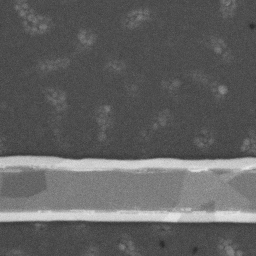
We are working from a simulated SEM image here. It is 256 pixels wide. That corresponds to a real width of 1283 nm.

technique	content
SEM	one or a few lines or trenches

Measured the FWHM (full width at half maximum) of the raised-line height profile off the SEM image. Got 262 nm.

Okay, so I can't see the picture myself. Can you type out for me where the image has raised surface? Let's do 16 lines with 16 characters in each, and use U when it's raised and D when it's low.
DDDDDDDDDDDDDDDD
DDDDDDDDDDDDDDDD
DDDDDDDDDDDDDDDD
DDDDDDDDDDDDDDDD
DDDDDDDDDDDDDDDD
DDDDDDDDDDDDDDDD
DDDDDDDDDDDDDDDD
DDDDDDDDDDDDDDDD
DDDDDDDDDDDDDDDD
DDDDDDDDDDDDDDDD
UUUUUUUUUUUUUUUU
UUUUUUUUUUUUUUUU
UUUUUUUUUUUUUUUU
DUUDDDUDDUUUUUUU
DDDDDDDDDDDDDDDD
DDDDDDDDDDDDDDDD